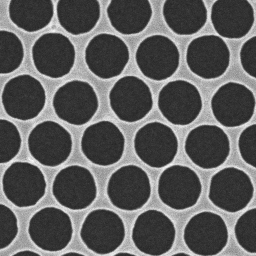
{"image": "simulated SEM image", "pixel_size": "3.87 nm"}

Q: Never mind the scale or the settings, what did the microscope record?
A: a regular array of holes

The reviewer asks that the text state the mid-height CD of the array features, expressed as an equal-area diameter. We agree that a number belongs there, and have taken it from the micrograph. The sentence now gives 0.17 micrometres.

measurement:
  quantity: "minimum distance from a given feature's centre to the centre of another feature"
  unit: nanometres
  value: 190